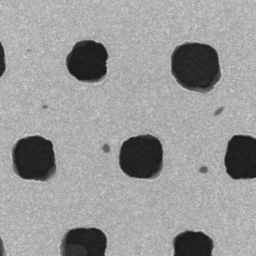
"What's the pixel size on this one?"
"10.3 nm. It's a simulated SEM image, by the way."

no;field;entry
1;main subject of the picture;holes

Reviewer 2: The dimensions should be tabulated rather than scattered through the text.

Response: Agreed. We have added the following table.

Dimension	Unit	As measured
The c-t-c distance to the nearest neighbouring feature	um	1.1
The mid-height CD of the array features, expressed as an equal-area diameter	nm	459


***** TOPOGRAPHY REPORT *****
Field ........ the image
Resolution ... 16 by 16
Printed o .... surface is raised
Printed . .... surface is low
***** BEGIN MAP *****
oooooooooooooooo
oooooooooooooooo
oooooooooooooooo
oooo...oooo...oo
oooo...oooo...oo
oooooooooooo.ooo
oooooooooooooooo
oooooooooooooooo
oooooooooooooooo
o..ooooo..oooo..
o..ooooo..oooo..
oooooooooooooooo
oooooooooooooooo
oooooooooooooooo
oooo..oooooooooo
oooo...oooo..ooo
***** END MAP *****